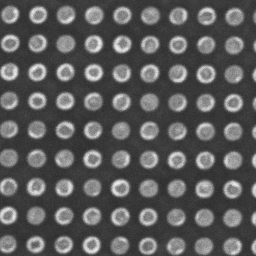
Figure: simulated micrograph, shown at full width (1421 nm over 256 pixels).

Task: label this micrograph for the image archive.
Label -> a regular array of raised bodies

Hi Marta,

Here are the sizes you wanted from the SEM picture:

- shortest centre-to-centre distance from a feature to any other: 155 nanometers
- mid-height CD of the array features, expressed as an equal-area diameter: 17.5 px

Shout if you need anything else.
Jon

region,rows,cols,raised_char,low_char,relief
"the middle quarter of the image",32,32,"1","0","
11000011100000110000111000001000
11000111100011111001111100011100
11000111110011111001111100111100
11000011100001110001111000011100
00000000000000000000000000000000
00000000000000000000000000000000
00000000000000000000000000000000
10000001000000100000000000000000
11000111100001110001111000011100
11000111100011110001111100111100
11000111100011110001111000111100
00000000000001100000010000011000
00000000000000000000000000000000
00000000000000000000000000000000
00000000000000000000000000000000
11000111100001110000111000011100
11000111100011110001111000111110
11000111100011110001111000111100
00000011000001100000110000011100
00000000000000000000000000000000
00000000000000000000000000000000
00000000000000000000000000000000
11000111100001110000111000011100
11000111100011110001111000111100
11000111100011110001111000111100
10000011000001110000111000011100
00000000000000000000000000000000
00000000000000000000000000000000
00000000000000000000000000000000
11000011100001110000111000011000
11000111100011110001111000111100
11000111100011110001111000111100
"